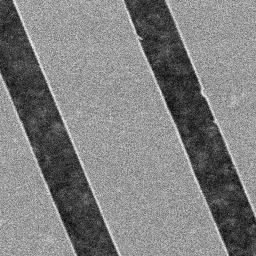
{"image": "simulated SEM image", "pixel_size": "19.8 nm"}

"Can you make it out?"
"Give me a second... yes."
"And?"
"one or a few lines or trenches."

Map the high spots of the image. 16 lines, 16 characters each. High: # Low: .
.#######...#####
.#######...#####
..#######..#####
..#######...####
...######...####
...#######...###
#...######...###
#...#######..###
##..#######...##
##...#######..##
##...#######...#
###...######...#
###...#######...
####..#######...
####...#######..
#####..#######..